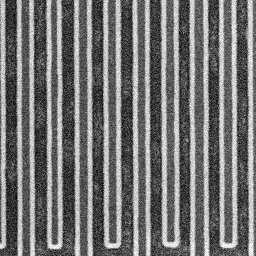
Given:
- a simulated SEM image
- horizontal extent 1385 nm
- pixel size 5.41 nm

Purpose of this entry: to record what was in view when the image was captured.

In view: parallel lines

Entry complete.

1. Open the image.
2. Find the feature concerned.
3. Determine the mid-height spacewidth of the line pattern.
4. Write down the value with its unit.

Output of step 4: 90.6 nanometers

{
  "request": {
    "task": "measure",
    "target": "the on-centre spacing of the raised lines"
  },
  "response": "156 nm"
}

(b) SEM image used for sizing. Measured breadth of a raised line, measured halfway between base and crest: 68.3 nm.